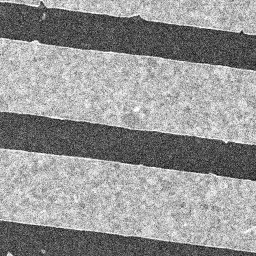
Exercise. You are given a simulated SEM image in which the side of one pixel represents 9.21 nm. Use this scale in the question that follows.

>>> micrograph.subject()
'one or a few lines or trenches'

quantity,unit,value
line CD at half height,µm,0.654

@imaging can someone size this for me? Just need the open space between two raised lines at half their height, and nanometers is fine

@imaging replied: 338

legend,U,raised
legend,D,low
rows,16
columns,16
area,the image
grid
DDDDUUUUUUUUUUUU
DDDDDDDDDDDUUUUU
UDDDDDDDDDDDDDDD
UUUUUUUUUDDDDDDD
UUUUUUUUUUUUUUUU
UUUUUUUUUUUUUUUU
UUUUUUUUUUUUUUUU
DDDDDUUUUUUUUUUU
DDDDDDDDDDDDUUUU
UUDDDDDDDDDDDDDD
UUUUUUUUUUDDDDDD
UUUUUUUUUUUUUUUU
UUUUUUUUUUUUUUUU
UUUUUUUUUUUUUUUU
DDDDDDUUUUUUUUUU
DDDDDDDDDDDDDDUU